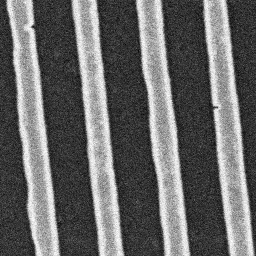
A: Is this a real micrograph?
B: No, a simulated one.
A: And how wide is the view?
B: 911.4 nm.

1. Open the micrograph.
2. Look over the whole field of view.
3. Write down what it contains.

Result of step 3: one or a few lines or trenches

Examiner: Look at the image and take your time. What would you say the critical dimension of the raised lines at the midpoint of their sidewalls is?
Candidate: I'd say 64.6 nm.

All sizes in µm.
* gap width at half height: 0.166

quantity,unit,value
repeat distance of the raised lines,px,64.6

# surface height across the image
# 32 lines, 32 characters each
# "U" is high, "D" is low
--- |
DUUUDDDDDUUUDDDDDUUUDDDDDDUUDDDD
DUUUDDDDDDUUDDDDDDUUDDDDDDUUDDDD
DUUUDDDDDDUUDDDDDDUUDDDDDDUUDDDD
DDUUDDDDDDUUDDDDDDUUDDDDDDUUDDDD
DDUUDDDDDDUUDDDDDDUUDDDDDDUUDDDD
DDUUDDDDDDUUDDDDDDUUDDDDDDUUUDDD
DDUUDDDDDDUUDDDDDDUUDDDDDDUUUDDD
DDUUDDDDDDUUDDDDDDUUUDDDDDDUUDDD
DDUUUDDDDDUUUDDDDDUUUDDDDDDUUDDD
DDUUUDDDDDDUUDDDDDUUUDDDDDDUUDDD
DDUUUDDDDDDUUDDDDDDUUDDDDDDUUDDD
DDUUUDDDDDDUUDDDDDDUUDDDDDDUUDDD
DDDUUDDDDDDUUDDDDDDUUDDDDDDUUDDD
DDDUUDDDDDDUUDDDDDDUUDDDDDDUUDDD
DDDUUDDDDDDUUDDDDDDUUDDDDDDUUUDD
DDDUUDDDDDDUUDDDDDDUUUDDDDDUUUDD
DDDUUDDDDDDUUDDDDDDUUUDDDDDUUUDD
DDDUUDDDDDDUUDDDDDDUUUDDDDDUUUDD
DDDUUUDDDDDUUUDDDDDUUUDDDDDUUUDD
DDDUUUDDDDDUUUDDDDDUUUDDDDDDUUDD
DDDUUUDDDDDDUUDDDDDDUUDDDDDDUUDD
DDDDUUDDDDDDUUDDDDDDUUDDDDDDUUDD
DDDDUUDDDDDDUUDDDDDDUUDDDDDDUUDD
DDDDUUDDDDDDUUDDDDDDUUDDDDDDUUUD
DDDDUUDDDDDDUUDDDDDDUUUDDDDDUUUD
DDDDUUDDDDDDUUDDDDDDUUUDDDDDUUUD
DDDDUUDDDDDDUUDDDDDDUUUDDDDDUUUD
DDDDUUUDDDDDUUUDDDDDDUUDDDDDUUUD
DDDDUUUDDDDDUUUDDDDDDUUDDDDDDUUD
DDDDUUUDDDDDDUUDDDDDDUUDDDDDDUUD
DDDDDUUDDDDDDUUDDDDDDUUDDDDDDUUD
DDDDDUUDDDDDDUUDDDDDDUUDDDDDDUUD